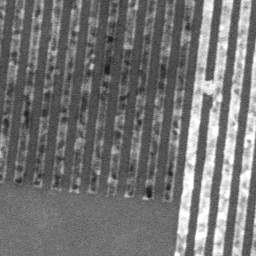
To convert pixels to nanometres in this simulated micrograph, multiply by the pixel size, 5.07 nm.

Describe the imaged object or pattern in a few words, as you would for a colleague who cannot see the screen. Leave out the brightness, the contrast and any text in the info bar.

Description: parallel lines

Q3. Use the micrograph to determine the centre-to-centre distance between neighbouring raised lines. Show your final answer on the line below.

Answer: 0.0949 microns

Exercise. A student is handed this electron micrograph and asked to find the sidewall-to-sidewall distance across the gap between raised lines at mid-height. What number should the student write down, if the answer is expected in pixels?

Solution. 11.7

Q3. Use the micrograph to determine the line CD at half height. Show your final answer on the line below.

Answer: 39.7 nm